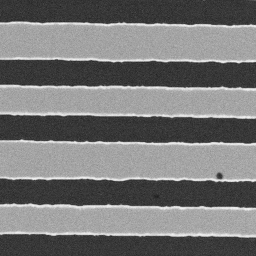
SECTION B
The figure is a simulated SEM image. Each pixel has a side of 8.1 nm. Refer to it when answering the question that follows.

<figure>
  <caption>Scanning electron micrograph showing lines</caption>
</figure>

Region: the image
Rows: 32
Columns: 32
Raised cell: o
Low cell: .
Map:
................................
................................
................................
oooooooooooooooooooooooooooooooo
oooooooooooooooooooooooooooooooo
oooooooooooooooooooooooooooooooo
oooooooooooooooooooooooooooooooo
........oooooooooooooooooooooooo
................................
................................
................................
oooooooooooooooooooooooooooooooo
oooooooooooooooooooooooooooooooo
oooooooooooooooooooooooooooooooo
.................oo.oooooooooooo
................................
................................
................................
oooooooooooooooooooooooooooooooo
oooooooooooooooooooooooooooooooo
oooooooooooooooooooooooooooooooo
oooooooooooooooooooooooooooooooo
..............oo.....oo.oooooooo
................................
................................
................................
oooooooooooooooooooooooooooooooo
oooooooooooooooooooooooooooooooo
oooooooooooooooooooooooooooooooo
.................o...ooooooooooo
................................
................................